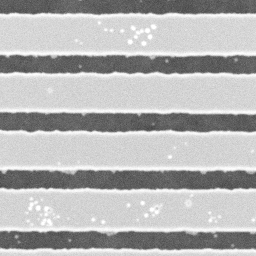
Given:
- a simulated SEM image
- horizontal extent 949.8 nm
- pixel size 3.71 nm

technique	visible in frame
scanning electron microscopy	lines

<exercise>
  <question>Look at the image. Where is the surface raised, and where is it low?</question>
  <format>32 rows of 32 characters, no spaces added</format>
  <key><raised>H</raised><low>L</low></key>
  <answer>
LLLLLLLLLLLLLLLLLLLLLLLLLLLLLLLL
LLLLLLLLLLLLLLLLLLLLLLLLLLLLLLLL
HHHHHHHHHHHHHHHHHHHHHHHHHHHHHHHH
HHHHHHHHHHHHHHHHHHHHHHHHHHHHHHHH
HHHHHHHHHHHHHHHHHHHHHHHHHHHHHHHH
HHHHHHHHHHHHHHHHHHHHHHHHHHHHHHHH
HHHHHHHHHHHHHHHHHHHHHHHHHHHHHHHH
LLLLLLLLLLLLLLLLLLLLLLLLLLLLLLLL
LLLLLLLLLLLLLLLLLLLLLLLLLLLLLLLL
HHHHHHHHHHHHHHHHHHHHHHHHHHHHHHHH
HHHHHHHHHHHHHHHHHHHHHHHHHHHHHHHH
HHHHHHHHHHHHHHHHHHHHHHHHHHHHHHHH
HHHHHHHHHHHHHHHHHHHHHHHHHHHHHHHH
HHHHHHHHHHHHHHHHHHHHHHHHHHHHHHHH
LLLLLLLLLLLLLLLLLLLLLLLLLLLLLLLL
LLLLLLLLLLLLLLLLLLLLLLLLLLLLLLLL
HHHLHHHHHHHHLLLLHHHHHHLHLLHHHLLL
HHHHHHHHHHHHHHHHHHHHHHHHHHHHHHHH
HHHHHHHHHHHHHHHHHHHHHHHHHHHHHHHH
HHHHHHHHHHHHHHHHHHHHHHHHHHHHHHHH
HHHHHHHHHHHHHHHHHHHHHHHHHHHHHHHH
LLLLLLLLLLLLLLLLLLLLLLLLLLLLLLLL
LLLLLLLLLLLLLLLLLLLLLLLLLLLLLLLL
LLLLLLLLLLLLLLLLLLLLLLLLLLLLLLLL
HHHHHHHHHHHHHHHHHHHHHHHHHHHHHHHH
HHHHHHHHHHHHHHHHHHHHHHHHHHHHHHHH
HHHHHHHHHHHHHHHHHHHHHHHHHHHHHHHH
HHHHHHHHHHHHHHHHHHHHHHHHHHHHHHHH
HHHHHHHHHHHHHHHHHHHHHHHHHHHHHHHH
LLLLLLLLLLLLLLLLLLLLLLLLLLLLLLLL
LLLLLLLLLLLLLLLLLLLLLLLLLLLLLLLL
HHHHHHHHHHHHHHHHHHHHHHHHHHHHHHHH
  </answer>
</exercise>